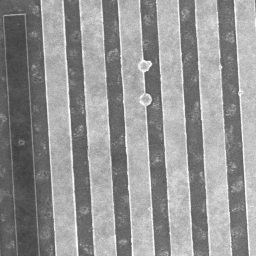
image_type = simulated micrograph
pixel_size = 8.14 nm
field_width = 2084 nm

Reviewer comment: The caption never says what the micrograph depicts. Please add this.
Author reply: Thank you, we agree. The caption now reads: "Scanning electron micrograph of parallel lines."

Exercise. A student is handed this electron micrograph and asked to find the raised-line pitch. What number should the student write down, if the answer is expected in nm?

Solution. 312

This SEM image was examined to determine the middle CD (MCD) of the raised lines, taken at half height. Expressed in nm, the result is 174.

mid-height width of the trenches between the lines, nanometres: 136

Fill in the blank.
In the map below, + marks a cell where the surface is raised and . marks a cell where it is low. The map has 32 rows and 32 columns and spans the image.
.....+++..+++..++...++..+++..+++
.....+++..+++..++...++..+++..+++
+++..+++..+++..++...++...++..+++
.++..+++..+++..+++..++...++..+++
.++..+++..+++..+++..++...++...++
.++...++..+++..+++..+++..++...++
.++...++..+++..+++..+++..++...++
.+++..++..+++..+++..+++..++...++
.+++..++..+++..++++.+++..+++..++
.+++..++...++..+++..+++..+++..++
.+++..++...++..+++..+++..+++..++
.+++..+++..++..+++..+++..+++..++
.+++..+++..++..++++.+++..+++..++
.+++..+++..++...++..+++..+++..++
.+++..+++..++...++..+++..+++..++
.+++..+++..++...++...++..+++..++
.+++..+++..+++..++...++..+++..++
.+++..+++..+++..++...++..+++..++
.+++..+++..+++..++...++..+++..++
.+++..+++..+++..++...++...++..++
..++..+++..+++..+++..++...++..++
..++..+++..+++..+++..++...++...+
..++...++..+++..+++..+++..++...+
..++...++..+++..+++..+++..++...+
..+++..++..+++..+++..+++..++...+
..+++..++..+++..+++..+++..++...+
..+++..++...++..+++..+++..+++..+
..+++..++...++..+++..+++..+++..+
..+++..++...++..+++..+++..+++..+
..+++..+++..++..+++..+++..+++..+
..+++..+++..++...++..+++..+++..+
..+++..+++..++...++..+++..+++..+